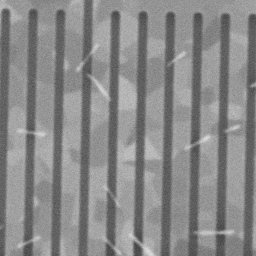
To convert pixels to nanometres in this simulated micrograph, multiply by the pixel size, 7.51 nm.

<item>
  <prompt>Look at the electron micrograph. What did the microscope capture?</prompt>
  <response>groups of lines, slits or small figures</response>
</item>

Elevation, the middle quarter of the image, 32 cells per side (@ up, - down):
@@@@@--@@@@---@@@@---@@@@---@@@@
@@@@---@@@@---@@@@---@@@@---@@@@
@@@@---@@@@---@@@@---@@@@---@@@@
@@@@---@@@@---@@@@---@@@@---@@@@
@@@@---@@@@---@@@@---@@@@---@@@@
@@@@---@@@@---@@@@---@@@@---@@@@
@@@@---@@@@---@@@@---@@@@---@@@@
@@@@---@@@@---@@@@---@@@@---@@@@
@@@@---@@@@---@@@@---@@@@---@@@@
@@@@---@@@@---@@@@---@@@@---@@@@
@@@@---@@@@---@@@@---@@@@---@@@@
@@@@---@@@@---@@@@---@@@@---@@@-
@@@@---@@@@---@@@@---@@@@---@@@-
@@@@---@@@@---@@@@---@@@@---@@@-
@@@@---@@@@---@@@@---@@@@---@@@-
@@@@---@@@@---@@@@---@@@@--@@@@-
@@@@---@@@@---@@@@---@@@@--@@@@-
@@@@---@@@@---@@@@---@@@@--@@@@-
@@@@---@@@@---@@@@---@@@@--@@@@-
@@@@---@@@@---@@@@--@@@@@--@@@@-
@@@@---@@@@---@@@@--@@@@@--@@@@@
@@@@---@@@@---@@@@--@@@@@--@@@@-
@@@@---@@@@--@@@@@--@@@@@--@@@@-
@@@@---@@@@--@@@@@--@@@@@--@@@@-
@@@@---@@@@--@@@@@--@@@@---@@@@-
@@@@---@@@@--@@@@@--@@@@---@@@@-
@@@@--@@@@@--@@@@@--@@@@---@@@@-
@@@@--@@@@@--@@@@@--@@@@---@@@@-
@@@@--@@@@@--@@@@---@@@@---@@@@-
@@@@--@@@@@--@@@@---@@@@---@@@@-
@@@@--@@@@@--@@@@---@@@@---@@@@-
@@@@--@@@@@--@@@@---@@@@---@@@@-